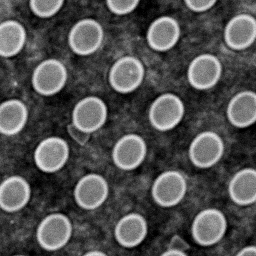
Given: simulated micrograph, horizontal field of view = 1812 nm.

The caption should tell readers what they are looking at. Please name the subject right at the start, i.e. a regular array of raised bodies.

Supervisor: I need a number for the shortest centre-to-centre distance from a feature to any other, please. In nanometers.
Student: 385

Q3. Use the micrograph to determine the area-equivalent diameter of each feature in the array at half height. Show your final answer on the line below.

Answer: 0.236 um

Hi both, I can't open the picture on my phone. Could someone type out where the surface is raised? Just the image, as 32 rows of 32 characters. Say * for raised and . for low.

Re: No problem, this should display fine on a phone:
....****......***......****.....
....***.......**................
....................**.......***
***......****......***......****
***......****......***......****
***......***.......***.......**.
**........*.....................
...............**.......***.....
.....***......****......****....
....****......****......***.....
....****......***.......***.....
.....**.........................
..........**........**.......***
***......****......****......***
***......****......****......***
***......****......***.......**.
**..............................
......**.......***......***.....
.....***......****......****....
....****......****......****....
.....***.......**.......***.....
.....................*........**
.**.......***.......***......***
****......***......****......***
****.....****......****......***
***.......***.......**..........
.........................**.....
......**.......***......****....
.....****......***......****....
.....****......***......****....
.....***.......**........*......
.....................**.......**